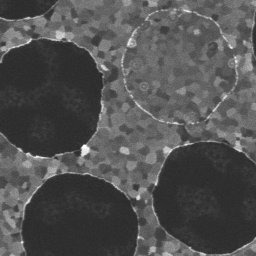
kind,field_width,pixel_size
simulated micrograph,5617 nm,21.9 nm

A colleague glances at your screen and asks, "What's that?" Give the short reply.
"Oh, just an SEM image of holes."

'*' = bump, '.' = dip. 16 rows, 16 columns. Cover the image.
...*************
****************
**.*************
......**********
......**********
......**********
......**********
......**********
......**********
**..*******....*
**********......
***....***......
**......**......
*........*......
*........*......
*........***...*